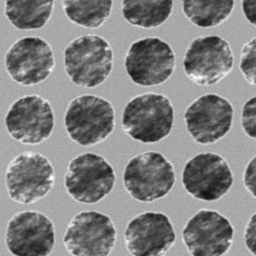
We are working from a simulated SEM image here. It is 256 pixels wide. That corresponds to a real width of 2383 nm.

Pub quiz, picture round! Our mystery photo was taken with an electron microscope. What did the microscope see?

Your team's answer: a regular array of holes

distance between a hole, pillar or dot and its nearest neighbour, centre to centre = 0.543 um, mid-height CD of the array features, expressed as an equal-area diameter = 48.9 px